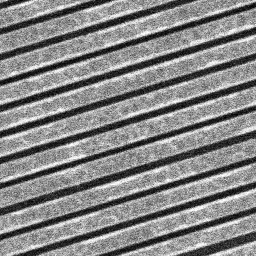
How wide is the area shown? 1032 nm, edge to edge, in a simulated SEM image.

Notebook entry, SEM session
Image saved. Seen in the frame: parallel lines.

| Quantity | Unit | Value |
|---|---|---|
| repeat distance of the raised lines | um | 0.0988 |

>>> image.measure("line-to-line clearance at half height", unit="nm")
33.3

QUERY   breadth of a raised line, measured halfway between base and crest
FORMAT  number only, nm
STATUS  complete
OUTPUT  66.9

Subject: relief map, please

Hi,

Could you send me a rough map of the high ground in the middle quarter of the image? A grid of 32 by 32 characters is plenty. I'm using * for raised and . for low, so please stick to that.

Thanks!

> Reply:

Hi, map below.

.**************........*********
************.......*************
*********.......**************..
******.......**************.....
**........**************.......*
......**************........****
...**************.......********
**************.......***********
***********.......**************
*******.......***************...
****.......**************.......
*.......**************.......***
.....**************.......******
.**************........*********
************.......*************
*********.......**************..
******.......**************.....
**........**************......**
......**************.......*****
...**************......*********
**************......************
***********......**************.
*******.......**************....
****......***************.......
*......**************.......****
....**************.......*******
.**************.......**********
***********........*************
********.......**************...
*****........*************......
**........*************......***
.....***************......******